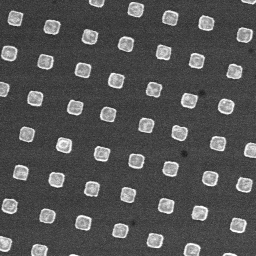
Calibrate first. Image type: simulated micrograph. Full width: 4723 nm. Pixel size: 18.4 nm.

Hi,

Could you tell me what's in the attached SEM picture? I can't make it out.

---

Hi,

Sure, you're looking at a regular array of raised bodies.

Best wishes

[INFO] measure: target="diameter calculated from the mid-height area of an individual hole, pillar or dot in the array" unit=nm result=276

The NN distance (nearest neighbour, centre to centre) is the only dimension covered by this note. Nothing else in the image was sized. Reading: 648 nanometres